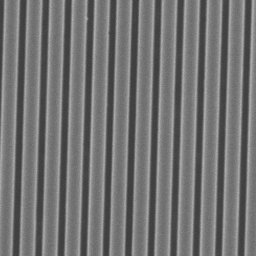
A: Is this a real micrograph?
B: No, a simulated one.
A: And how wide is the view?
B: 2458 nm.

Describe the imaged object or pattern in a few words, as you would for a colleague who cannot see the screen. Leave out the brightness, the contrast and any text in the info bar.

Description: parallel lines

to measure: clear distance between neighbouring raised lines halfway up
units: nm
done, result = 71.9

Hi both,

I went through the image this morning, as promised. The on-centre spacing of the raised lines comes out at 0.216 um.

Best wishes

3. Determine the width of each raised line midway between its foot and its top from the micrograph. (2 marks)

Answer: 144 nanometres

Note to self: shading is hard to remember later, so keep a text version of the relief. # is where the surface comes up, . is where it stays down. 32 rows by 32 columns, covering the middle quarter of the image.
..###..####..###..####..####..##
..###..####..###..####..####..##
..###..####..###..####..####..##
..###..####..###..####..####..##
.####..####..###..####..####..##
.####..####..###..####..####..##
.####..####..###..####..###...##
.####..####..###..####..###...##
.####..####..###..####..###...##
.####..####..###..####..###..###
.####..####..###..####..###..###
.####..###...###..####..###..###
.####..###...###..####..###..###
.####..###..####..####..###..###
.####..###..####..####..###..###
.####..###..####..####..###..###
.####..###..####..####..###..###
.####..###..####..####..###..###
.####..###..####..####..###..###
.####..###..####..###...###..###
.####..###..####..###...###..###
.####..###..####..###...###..###
.####..###..####..###..####..###
.###...###..####..###..####..###
.###...###..####..###..####..###
.###...###..####..###..####..###
.###..####..####..###..####..###
.###..####..####..###..####..###
.###..####..####..###..####..###
.###..####..####..###..####..###
.###..####..####..###..####..###
.###..####..###...###..####..###